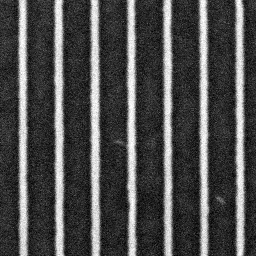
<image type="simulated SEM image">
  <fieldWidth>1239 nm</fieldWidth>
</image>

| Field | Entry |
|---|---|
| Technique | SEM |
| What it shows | parallel lines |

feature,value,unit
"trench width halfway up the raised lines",0.147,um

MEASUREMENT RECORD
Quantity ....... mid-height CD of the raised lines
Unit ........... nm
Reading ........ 26.6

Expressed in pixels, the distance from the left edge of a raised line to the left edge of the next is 36.2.